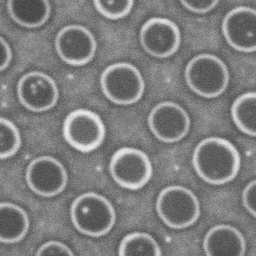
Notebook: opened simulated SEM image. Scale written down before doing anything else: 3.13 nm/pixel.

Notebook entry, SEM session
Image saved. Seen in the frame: a regular array of raised bodies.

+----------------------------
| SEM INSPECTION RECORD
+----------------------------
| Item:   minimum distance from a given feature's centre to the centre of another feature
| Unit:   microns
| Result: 0.188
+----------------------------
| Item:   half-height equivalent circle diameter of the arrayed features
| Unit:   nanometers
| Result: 124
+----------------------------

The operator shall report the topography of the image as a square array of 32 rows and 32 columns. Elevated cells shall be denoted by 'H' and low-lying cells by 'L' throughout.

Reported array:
LHHHHHLLLLLLHHHHLLLLLLLHHHHLLLLL
LHHHHHLLLLLLLHHHLLLLLLLLLLLLLHHH
LLHHHHLLLLLLLLLLLLLHHLLLLLLLHHHH
LLLLLLLLHHLLLLLLLLHHHHLLLLLLHHHH
LLLLLLLHHHHLLLLLLLHHHHLLLLLLHHHH
HLLLLLLHHHHHLLLLLLHHHHLLLLLLLHHH
HLLLLLLHHHHHLLLLLLLHHHLLLLLLLLLL
HLLLLLLLHHHLLLLLLLLLLLLLHHHLLLLL
LLLLLLLLLLLLLLHHHLLLLLLHHHHHLLLL
LLLHHHLLLLLLLHHHHLLLLLLHHHHHLLLL
LLHHHHHLLLLLLHHHHHLLLLLLHHHHLLLL
LLHHHHHLLLLLLHHHHHLLLLLLLHHHLLLL
LLLHHHHLLLLLLLHHHLLLLLLLLLLLLLHH
LLLLHHLLLLLLLLLLLLLHHHLLLLLLLHHH
LLLLLLLLLHHHLLLLLLLHHHHLLLLLLHHH
HLLLLLLLHHHHHLLLLLLHHHHHLLLLLLHH
HHLLLLLLHHHHHLLLLLLHHHHLLLLLLLLH
HHLLLLLLHHHHHLLLLLLLHHLLLLHLLLLL
HHLLLLLLLHHHLLLLLLLLLLLLLHHHHLLL
HLLLLLLLLLLLLLHHHHLLLLLLHHHHHHLL
LLLLHHHLLLLLLLHHHHHLLLLLHHHHHHLL
LLLHHHHHLLLLLLHHHHHLLLLLLHHHHHLL
LLLHHHHHLLLLLLLHHHLLLLLLLLHHLLLL
LLLLHHHHLLLLLLLLHLLLLHHLLLLLLLLH
LLLLLLLLLLHHLLLLLLLLHHHHLLLLLLHH
LLLLLLLLLHHHHHLLLLLLHHHHHLLLLLLH
HHHLLLLLLHHHHHLLLLLLHHHHHLLLLLLH
HHHLLLLLLHHHHHLLLLLLLHHHLLLLLLLL
HHHLLLLLLLHHHHLLLLLLLLLLLLLHHLLL
HHHLLLLLLLLLLLLLHHHLLLLLLLHHHHLL
LLLLLLHHLLLLLLLHHHHHLLLLLLHHHHLL
LLLLLHHHHLLLLLLHHHHHLLLLLLHHHHLL